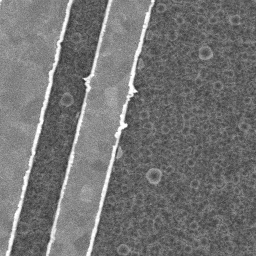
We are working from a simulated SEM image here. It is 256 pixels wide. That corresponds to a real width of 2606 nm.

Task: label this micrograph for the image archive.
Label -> one or a few lines or trenches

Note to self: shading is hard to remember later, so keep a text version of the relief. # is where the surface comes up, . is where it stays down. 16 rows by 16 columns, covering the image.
####...##.......
####..###.......
####..###.......
####..###.......
###...##........
###..###........
###..###........
###..###........
##...##.........
##..###.........
##..###.........
##..###.........
#...##..........
#..###..........
#..###..........
#..###..........